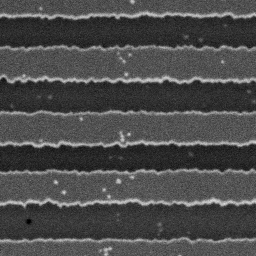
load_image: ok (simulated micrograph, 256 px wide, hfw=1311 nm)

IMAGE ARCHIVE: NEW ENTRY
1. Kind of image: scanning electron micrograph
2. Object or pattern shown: lines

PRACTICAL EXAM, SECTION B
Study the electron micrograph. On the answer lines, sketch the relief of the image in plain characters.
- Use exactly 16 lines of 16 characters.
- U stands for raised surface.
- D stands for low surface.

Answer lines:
UUUUUUUUUUUUUUUU
DDDDDDDDDDDDDDDD
DDDDDDDDDDDDDDDD
UUUUUUUUUUUUUUUU
UUUUUUUUUUUUUUUU
DDDDDDDDDDDDDDDD
DDDDDDDDDDDDDDDD
UUUUUUUUUUUUUUUU
UUUUUUUUUUUUUUUU
DDDDDDDDDDDDDDDD
DDDDDDDDDDDDDDDD
UUUUUUUUUUUUUUUU
UUUUUUUUUUUUUUUU
DDDDDDDDDDDDDDDD
DDDDDDDDDDDDDDDD
UUUUUUUUUUUUUUUU